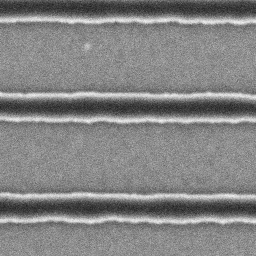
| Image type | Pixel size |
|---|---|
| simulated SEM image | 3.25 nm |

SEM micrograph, lines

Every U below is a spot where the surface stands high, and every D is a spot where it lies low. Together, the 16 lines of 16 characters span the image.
UUUUUUUUUUUUUUUU
DDDDDDDDDDDDDDDD
DDDDDDDDDDDDDDDD
DDDDDDDDDDDDDDDD
DDDDDDDDDDDDDDDD
DDDDDDDDDDDDDDDD
UUUUUUUUUUUUUUUU
UUUUUUUUUUUUUUUU
DDDDDDDDDDDDDDDD
DDDDDDDDDDDDDDDD
DDDDDDDDDDDDDDDD
DDDDDDDDDDDDDDDD
UUUUUUUUUUUUUUUU
UUUUUUUUUUUUUUUU
DDDDDDDDDDDDDDDD
DDDDDDDDDDDDDDDD